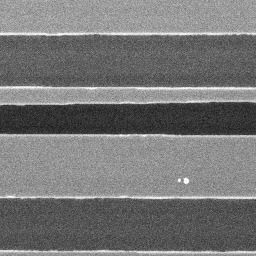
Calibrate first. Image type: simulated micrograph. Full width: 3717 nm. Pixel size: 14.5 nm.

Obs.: lines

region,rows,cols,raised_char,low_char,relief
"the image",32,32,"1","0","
11111111111111111111111111111111
11111111111111111111111111111111
11111111111111111111111111111111
11111111111111111111111111111111
00000000000000000000000000000000
00000000000000000000000000000000
00000000000000000000000000000000
00000000000000000000000000000000
00000000000000000000000000000000
00000000000000000000000000000000
00000000000000000000000000000000
11111111111111111111111111111111
11111111111111111111111111111111
00000000000000000000000000000000
00000000000000000000000000000000
00000000000000000000000000000000
00000000000000000000000000000000
11111111111111111111111111111111
11111111111111111111111111111111
11111111111111111111111111111111
11111111111111111111111111111111
11111111111111111111111111111111
11111111111111111111111111111111
11111111111111111111111111111111
11111111111111111111111111111111
00000000000000000000000000000000
00000000000000000000000000000000
00000000000000000000000000000000
00000000000000000000000000000000
00000000000000000000000000000000
00000000000000000000000000000000
11111111111111111100000000000000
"